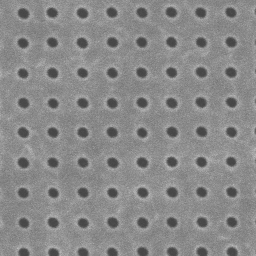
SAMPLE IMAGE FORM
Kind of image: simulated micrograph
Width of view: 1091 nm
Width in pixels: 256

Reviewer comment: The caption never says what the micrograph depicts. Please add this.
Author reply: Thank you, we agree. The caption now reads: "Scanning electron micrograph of a regular array of holes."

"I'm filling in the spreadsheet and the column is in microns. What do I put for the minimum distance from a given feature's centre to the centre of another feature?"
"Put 0.126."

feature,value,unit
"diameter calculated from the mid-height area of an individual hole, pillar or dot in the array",46.9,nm